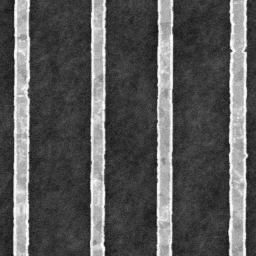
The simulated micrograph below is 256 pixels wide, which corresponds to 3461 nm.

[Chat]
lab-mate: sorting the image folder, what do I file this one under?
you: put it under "one or a few lines or trenches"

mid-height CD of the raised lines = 172 nm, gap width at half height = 804 nm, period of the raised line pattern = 72.1 px